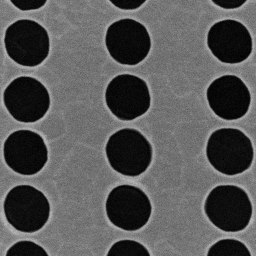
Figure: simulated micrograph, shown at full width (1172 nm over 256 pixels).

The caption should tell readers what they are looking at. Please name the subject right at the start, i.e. a regular array of holes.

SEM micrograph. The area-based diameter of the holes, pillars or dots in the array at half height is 209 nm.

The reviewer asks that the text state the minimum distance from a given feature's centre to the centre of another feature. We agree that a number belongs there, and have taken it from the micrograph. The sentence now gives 253 nanometers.